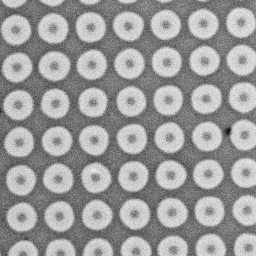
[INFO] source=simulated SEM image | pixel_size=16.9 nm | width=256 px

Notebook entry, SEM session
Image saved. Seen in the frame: an array of small figures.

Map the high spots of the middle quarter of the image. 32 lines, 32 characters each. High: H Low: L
HLLHHHHHHHLLLHHHHHHHLLHHHHHHHLLL
HLLHHHHHHHLLLHHHHHHHLLLHHHHHHLLL
HLLLHHHHHHLLLLHHHHHLLLLLHHHHLLLL
LLLLLLHHLLLLLLLLLLLLLLLLLLLLLLLL
LLLLLLLLLLLLLLLLLLLLLLLLLLLLLLLL
LLLLLLLLLLLLLLLLLLLLLLLLLLLLLLLL
LLLLLLHHHLLLLLLHHHHLLLLHHHHHHLLL
LLLLHHHHHHLLLLHHHHHHLLLHHHHHHLLL
HLLLHHHHHHHLLHHHHHHHLLLHHHHHHHLL
HLLLHHHHHHHLLHHHHHHHLLLHHHHHHHLL
HLLLHHHHHHHLLLHHHHHHLLLHHHHHHLLL
HLLLHHHHHHLLLLHHHHHHLLLHHHHHHLLL
LLLLLHHHHLLLLLLHHHLLLLLLLHHLLLLL
LLLLLLLLLLLLLLLLLLLLLLLLLLLLLLLL
LLLLLLLLLLLLLLLLLLLLLLLLLLLLLLLL
LLLLLLLLLLLLLLLLHHHLLLLLHHHHHLLL
HLLLLHHHHHLLLLHHHHHHLLLHHHHHHLLL
HLLLHHHHHHHLLLHHHHHHLLLHHHHHHHLL
HHLLHHHHHHHLLHHHHHHHHLLHHHHHHHLL
HHLLHHHHHHHLLLHHHHHHHLLHHHHHHHLL
HHLLHHHHHHHLLLHHHHHHLLLHHHHHHLLL
HLLLLHHHHHLLLLLHHHHLLLLLLHHHLLLL
LLLLLLLHHLLLLLLLLLLLLLLLLLLLLLLL
LLLLLLLLLLLLLLLLLLLLLLLLLLLLLLLL
LLLLLLLLLLLLLLLLLLLLLLLLLHHHLLLL
LLLLLLHHHHLLLLLHHHHHLLLLHHHHHLLL
HLLLLHHHHHHLLLHHHHHHHLLHHHHHHHLL
HHLLLHHHHHHLLLHHHHHHHLLHHHHHHHLL
HHLLLHHHHHHHLLHHHHHHHLLHHHHHHHLL
HHLLLHHHHHHLLLHHHHHHHLLHHHHHHHLL
HHLLLHHHHHHLLLLHHHHHLLLLHHHHHLLL
HLLLLLHHHHLLLLLLHHLLLLLLLLLLLLLL